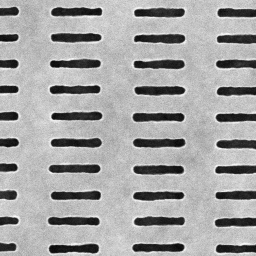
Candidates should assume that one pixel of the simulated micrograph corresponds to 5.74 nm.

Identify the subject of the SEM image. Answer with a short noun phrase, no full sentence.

a regular array of holes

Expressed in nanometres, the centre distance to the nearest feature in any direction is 150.